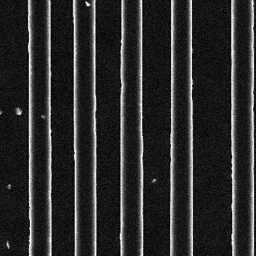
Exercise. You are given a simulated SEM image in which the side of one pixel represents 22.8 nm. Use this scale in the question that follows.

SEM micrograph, lines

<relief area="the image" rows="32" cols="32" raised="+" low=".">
....++...+++...+++....++.....+++
....++...+++...+++....++.....+++
....++...+++...+++....++.....+++
....++...+++...+++....++.....+++
....++...+++...+++....++.....+++
....++...+++...+++....++.....+++
....++...+++...+++....++.....+++
....++...+++...+++....++.....+++
....++...+++...+++....++.....+++
....++...+++...+++....++.....+++
....++...+++...+++....++.....+++
....++...+++...+++....++.....+++
....++...+++...+++....++.....+++
....++...+++...+++....++.....+++
....++...+++...+++....++.....+++
....++...+++...+++....++.....+++
....++...+++...+++...+++.....+++
....++...+++...+++...+++.....+++
....++...+++...+++...+++.....+++
....++...+++...+++...+++.....+++
....++...+++...+++...+++.....+++
....++...+++...+++...+++.....+++
....++...+++...+++...+++.....+++
....++...+++...+++...+++.....+++
....++...+++...+++...+++.....+++
....++...+++...+++...+++.....+++
....++...+++...+++...+++.....+++
....++...+++...+++...+++.....+++
....++...+++...+++...+++.....+++
....++...+++...+++...+++.....+++
....++...+++...+++...+++.....+++
....++...+++...+++...+++.....+++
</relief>